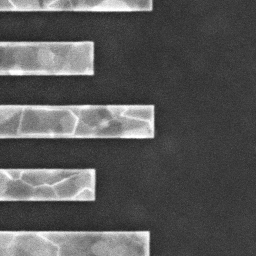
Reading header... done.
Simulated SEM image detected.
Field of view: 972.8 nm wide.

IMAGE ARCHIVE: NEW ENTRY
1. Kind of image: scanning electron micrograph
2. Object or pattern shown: parallel lines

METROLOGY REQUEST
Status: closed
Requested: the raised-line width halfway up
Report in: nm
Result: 118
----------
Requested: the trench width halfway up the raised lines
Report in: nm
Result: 121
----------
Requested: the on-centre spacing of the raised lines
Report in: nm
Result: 242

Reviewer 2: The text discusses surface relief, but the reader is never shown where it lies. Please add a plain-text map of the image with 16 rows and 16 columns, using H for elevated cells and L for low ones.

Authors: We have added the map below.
HHHHHHHHHLLLLLLL
LLLLLLLLLLLLLLLL
LLLLLLLLLLLLLLLL
HHHHHHLLLLLLLLLL
HHHHHHLLLLLLLLLL
LLLLLLLLLLLLLLLL
LLLLLLLLLLLLLLLL
HHHHHHHHHHLLLLLL
HHHHHHHHHLLLLLLL
LLLLLLLLLLLLLLLL
LLLLLLLLLLLLLLLL
HHHHHHLLLLLLLLLL
HHHHHLLLLLLLLLLL
LLLLLLLLLLLLLLLL
LLLLLLLLLLLLLLLL
HHHHHHHHHLLLLLLL